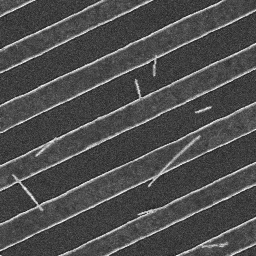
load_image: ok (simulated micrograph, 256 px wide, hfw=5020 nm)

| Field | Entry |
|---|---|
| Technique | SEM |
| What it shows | lines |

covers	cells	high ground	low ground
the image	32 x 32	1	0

11100000000011111100000000011111
10000000001111110000000001111111
00000000111111000000000111111100
00000011111100000000111111100000
00001111110000000011111110000000
01111111000000001111111000000000
11111100000000111111100000000011
11110000000011111110000000001111
10000000001111111000000001111111
00000000111111100000000111111100
00000011111110000000011111110000
00001111111000000001111111000000
01111111100000000111111100000000
11111100000000011111110000000011
11110000000001111111000000001111
11000000000111111100000000111111
00000000011111100000000011111110
00000011111110000000001111111000
00000111111000000000111111100000
00011111100000000011111110000000
11111110000000001111111000000000
11111000000000111111100000000111
11100000000111111110000000011111
10000000011111111000000001111110
00000000111111000000000111111000
00000111111100000000011111100000
00011111110000000001111110000000
01111111000000000111111000000001
11111100000000011111100000000111
11110000000001111110000000011111
11000000000111110000000001111111
00000000111111000000000111111100